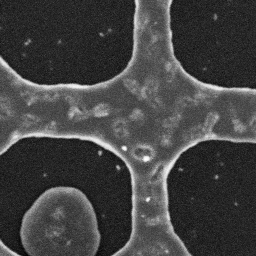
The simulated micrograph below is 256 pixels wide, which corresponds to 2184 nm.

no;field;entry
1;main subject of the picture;holes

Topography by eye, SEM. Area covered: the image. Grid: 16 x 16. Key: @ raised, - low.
---------@@-----
--------@@@-----
--------@@@-----
--------@@@-----
@-------@@@@----
@@@@@@@@@@@@@@--
@@@@@@@@@@@@@@@@
@@@@@@@@@@@@@@@@
@@-@@@@@@@@@@@@@
-------@@@@-----
--------@@@-----
--------@@------
--------@@------
--------@@@-----
--------@@@-----
--------@@@@----